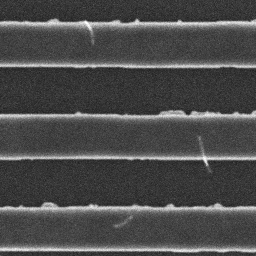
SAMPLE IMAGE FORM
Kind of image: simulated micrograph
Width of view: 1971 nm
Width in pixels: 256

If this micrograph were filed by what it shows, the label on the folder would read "lines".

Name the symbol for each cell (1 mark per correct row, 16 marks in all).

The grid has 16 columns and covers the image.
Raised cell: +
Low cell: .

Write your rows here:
................
++++++++++++++++
++++++++++++++++
++++++++++++++++
................
................
................
++++++++++++++++
++++++++++++++++
++++++++++++++++
................
................
................
++++++++++++++++
++++++++++++++++
++++++++++++++++